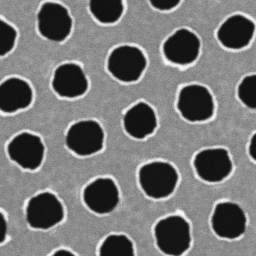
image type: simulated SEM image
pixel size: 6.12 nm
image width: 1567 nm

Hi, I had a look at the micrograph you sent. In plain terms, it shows a regular array of holes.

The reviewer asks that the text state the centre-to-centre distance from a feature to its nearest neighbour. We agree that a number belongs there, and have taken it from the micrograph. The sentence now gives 355 nm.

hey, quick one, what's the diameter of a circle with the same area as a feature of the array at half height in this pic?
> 220 nanometres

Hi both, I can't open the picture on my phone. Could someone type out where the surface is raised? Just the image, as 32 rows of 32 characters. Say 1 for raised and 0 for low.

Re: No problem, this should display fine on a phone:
11111101111000011110001111111111
11111000111000011111111111111111
11111000011100011111111111110001
00111000011111111111111111100000
00111000111111111111100001100000
00111111111111111111100001110001
01111111111111000011100001111111
11111111111111000011100011111111
11111110001111000011111111111111
11111110000111000111111111111110
00011110000111111111111111111100
00001110000111111111111000111100
00001111111111111111110000011100
00011111111111110001110000011110
11111111111111110001111000111111
11111111100011100000111111111111
11111111000001110001111111111111
11000111000001111111111111111110
10000011100001111111111111111110
10000111111111111111111110000110
11000111111111111110011100000111
11111111111111111000001110000111
11111111111100111000001111001111
11111111111000011100001111111111
11110001110000011110011111111111
11110000111000011111111111100111
11100000111100111111111111100011
01100000111111111111000111100001
01111011111111111110000011100001
01111111111111001110000011100011
11111111111110000111000011111111
11111110011100000111000111111111